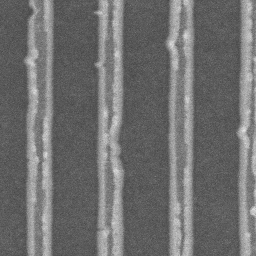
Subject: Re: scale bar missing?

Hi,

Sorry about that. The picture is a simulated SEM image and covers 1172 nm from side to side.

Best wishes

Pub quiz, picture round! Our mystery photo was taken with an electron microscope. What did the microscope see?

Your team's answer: one or a few lines or trenches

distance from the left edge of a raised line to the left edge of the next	323	nm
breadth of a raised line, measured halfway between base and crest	0.0847	micrometres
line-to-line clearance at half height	240	nm